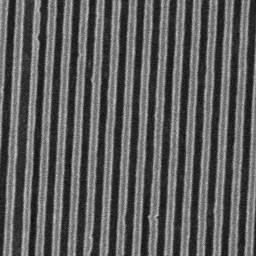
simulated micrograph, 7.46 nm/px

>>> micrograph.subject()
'parallel lines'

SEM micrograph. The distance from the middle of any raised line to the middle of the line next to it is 120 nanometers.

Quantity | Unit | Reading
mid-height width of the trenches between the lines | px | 8.61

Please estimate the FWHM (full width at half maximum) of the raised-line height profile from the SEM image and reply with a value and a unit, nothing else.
56.8 nanometers